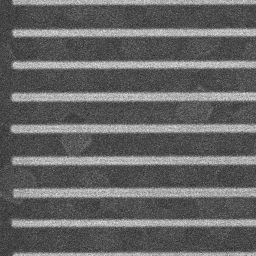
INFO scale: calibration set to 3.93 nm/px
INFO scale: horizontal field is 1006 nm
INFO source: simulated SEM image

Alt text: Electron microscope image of parallel lines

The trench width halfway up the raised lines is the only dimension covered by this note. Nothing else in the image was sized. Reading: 98.1 nanometres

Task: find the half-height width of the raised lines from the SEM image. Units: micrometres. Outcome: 0.028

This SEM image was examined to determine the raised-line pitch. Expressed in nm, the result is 124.